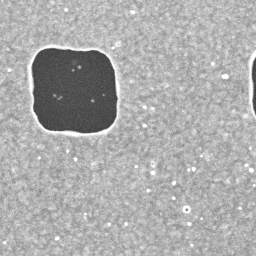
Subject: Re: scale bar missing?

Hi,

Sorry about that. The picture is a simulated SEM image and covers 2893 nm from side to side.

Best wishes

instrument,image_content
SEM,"holes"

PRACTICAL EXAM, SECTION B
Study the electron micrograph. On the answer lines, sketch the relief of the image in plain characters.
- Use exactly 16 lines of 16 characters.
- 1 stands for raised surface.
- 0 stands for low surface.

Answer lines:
1111111111111111
1111111111111111
1111111111111111
1100000111111111
1100000111111111
1100000111111111
1100000111111111
1100000111111111
1111111111111111
1111111111111111
1111111111111111
1111111111111111
1111111111111111
1111111111111111
1111111111111111
1111111111111111